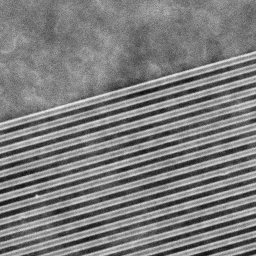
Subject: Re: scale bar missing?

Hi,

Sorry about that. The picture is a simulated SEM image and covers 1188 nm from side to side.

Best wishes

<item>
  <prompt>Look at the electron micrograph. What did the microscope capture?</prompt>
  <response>parallel lines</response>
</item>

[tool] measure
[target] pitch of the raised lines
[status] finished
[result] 11.5 px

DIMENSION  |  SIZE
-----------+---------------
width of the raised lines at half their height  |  27.3 nanometers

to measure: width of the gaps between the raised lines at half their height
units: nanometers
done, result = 27.9